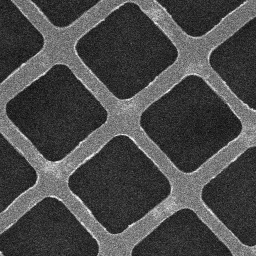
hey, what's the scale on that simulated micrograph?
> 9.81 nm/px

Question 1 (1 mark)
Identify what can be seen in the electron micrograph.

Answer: holes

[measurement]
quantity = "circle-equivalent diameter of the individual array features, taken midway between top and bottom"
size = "860 nanometres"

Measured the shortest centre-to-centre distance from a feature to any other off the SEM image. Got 919 nm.